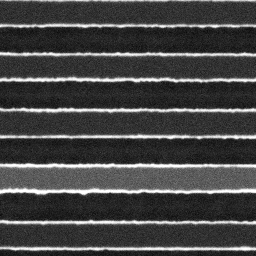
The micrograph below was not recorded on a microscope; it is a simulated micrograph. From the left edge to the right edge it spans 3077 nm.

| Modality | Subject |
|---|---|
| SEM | lines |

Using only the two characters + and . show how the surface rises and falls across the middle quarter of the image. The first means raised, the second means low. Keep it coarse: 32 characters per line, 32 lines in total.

++++++++++++++++++++++++++++++++
++++++++++++++++++++++++++++++++
++++++++++++++++++++++++++++++++
++++++++++++++++++++++++++++++++
................................
................................
................................
................................
................................
................................
................................
+++++++++++++++++++++++++.++++++
++++++++++++++++++++++++++++++++
++++++++++++++++++++++++++++++++
++++++++++++++++++++++++++++++++
++++++++++++++++++++++++++++++++
++++++++++++++++++++++++++++++++
++++++++++++++++++++++++++++++++
................................
................................
................................
................................
................................
................................
................................
++++++++++++++++++++++++++++++++
++++++++++++++++++++++++++++++++
++++++++++++++++++++++++++++++++
++++++++++++++++++++++++++++++++
++++++++++++++++++++++++++++++++
++++++++++++++++++++++++++++++++
++++++++++++++++++++++++++++++++